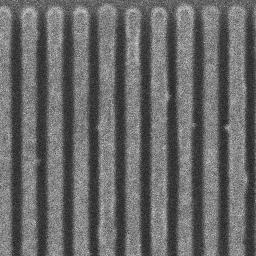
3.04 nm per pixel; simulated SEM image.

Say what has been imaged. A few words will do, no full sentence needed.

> parallel lines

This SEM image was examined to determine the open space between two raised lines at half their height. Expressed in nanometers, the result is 30.8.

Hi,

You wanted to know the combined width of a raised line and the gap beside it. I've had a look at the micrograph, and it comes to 78.9 nm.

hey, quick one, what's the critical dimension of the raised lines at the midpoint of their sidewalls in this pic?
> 47.5 nm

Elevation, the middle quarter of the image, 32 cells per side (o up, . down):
..oooo...oooo...ooo...oooo..oooo
..oooo...oooo...ooo...oooo..oooo
..oooo...oooo...ooo...oooo..oooo
..oooo...oooo...ooo...oooo..oooo
..oooo...oooo...ooo...oooo..oooo
..oooo...oooo...ooo...oooo..oooo
...ooo...oooo...ooo...oooo..oooo
...ooo...oooo...ooo...oooo..oooo
...ooo...oooo...ooo...oooo..oooo
...ooo...oooo...ooo...oooo..oooo
...ooo...oooo...ooo...oooo..oooo
...ooo...oooo...ooo...oooo..oooo
...ooo...oooo...ooo...oooo..oooo
...ooo...oooo...ooo...oooo..oooo
...ooo...oooo...ooo...oooo..oooo
...ooo..ooooo...ooo...oooo..oooo
...ooo...oooo...ooo...oooo...ooo
..oooo...oooo...ooo...oooo...ooo
..oooo...oooo...ooo...oooo...ooo
..oooo...oooo...ooo...oooo...ooo
..oooo...oooo...ooo...oooo...ooo
..oooo...oooo...ooo...oooo...ooo
..oooo...oooo...ooo...oooo...ooo
..oooo...oooo...ooo...oooo...ooo
..oooo...oooo...ooo...oooo...ooo
..oooo...oooo...ooo...oooo...ooo
..oooo...oooo...ooo...oooo...ooo
..oooo...oooo...ooo...oooo...ooo
..oooo...oooo...ooo...oooo...ooo
..oooo...oooo...ooo...oooo...ooo
..oooo...oooo...ooo...oooo...ooo
..oooo...oooo...ooo...oooo...ooo